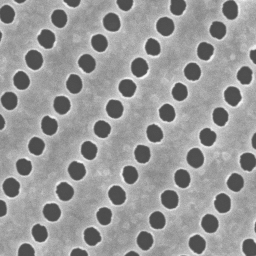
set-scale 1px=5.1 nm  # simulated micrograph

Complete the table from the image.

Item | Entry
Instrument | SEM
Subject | a regular array of holes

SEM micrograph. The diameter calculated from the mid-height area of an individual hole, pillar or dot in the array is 90.9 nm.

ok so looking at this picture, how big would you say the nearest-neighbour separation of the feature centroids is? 123 nm